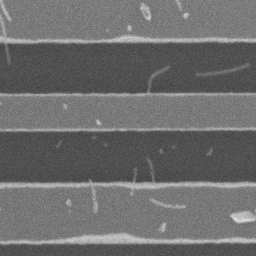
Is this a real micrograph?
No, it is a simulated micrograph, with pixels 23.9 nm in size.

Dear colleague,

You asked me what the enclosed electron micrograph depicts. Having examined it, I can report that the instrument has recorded lines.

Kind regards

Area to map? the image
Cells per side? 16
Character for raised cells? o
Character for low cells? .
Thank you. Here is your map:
oooooooooooooooo
oooooooooooooooo
oooooooooooooooo
................
................
................
oooooooooooooooo
oooooooooooooooo
................
................
................
.....ooooo.ooo.o
oooooooooooooooo
oooooooooooooooo
oooooooooooooooo
................